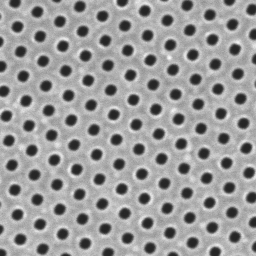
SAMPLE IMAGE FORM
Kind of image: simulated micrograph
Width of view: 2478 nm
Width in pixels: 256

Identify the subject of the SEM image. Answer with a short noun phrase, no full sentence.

a regular array of holes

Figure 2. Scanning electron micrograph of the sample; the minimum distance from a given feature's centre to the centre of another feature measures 0.237 micrometres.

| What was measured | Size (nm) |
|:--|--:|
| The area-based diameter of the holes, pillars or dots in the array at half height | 112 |